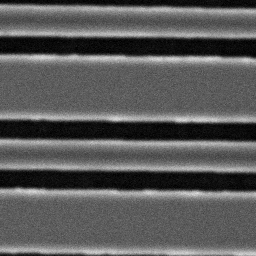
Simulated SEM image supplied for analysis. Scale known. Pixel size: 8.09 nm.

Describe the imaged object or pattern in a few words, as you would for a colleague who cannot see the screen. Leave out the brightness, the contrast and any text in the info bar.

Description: lines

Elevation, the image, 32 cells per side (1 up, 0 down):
00000000000000000000000000000000
11111111111111111111111111111111
11111111111111111111111111111111
11111111111111111111111111111111
00000000000000011111111111111111
00000000000000000000000000000000
00000000000000000000000000000000
11111111111111111111111111111111
11111111111111111111111111111111
11111111111111111111111111111111
11111111111111111111111111111111
11111111111111111111111111111111
11111111111111111111111111111111
11111111111111111111111111111111
11111111111111111111111111111111
00000000000000000000000000000000
00000000000000000000000000000000
00000000000000000000000000000000
11111111111111111111111111111111
11111111111111111111111111111111
11111111111111111111111111111111
00000000000000000000000000000000
00000000000000000000000000000000
00000000000000000000000000000000
11111111111111111111111111111111
11111111111111111111111111111111
11111111111111111111111111111111
11111111111111111111111111111111
11111111111111111111111111111111
11111111111111111111111111111111
11111111111111111111111111111111
01000111111111111111111111111111